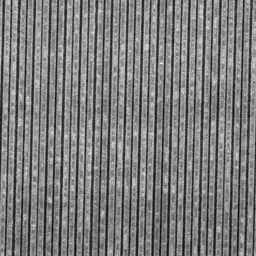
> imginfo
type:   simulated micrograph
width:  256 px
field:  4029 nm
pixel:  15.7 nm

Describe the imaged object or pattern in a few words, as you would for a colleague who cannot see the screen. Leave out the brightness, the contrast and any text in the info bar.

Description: parallel lines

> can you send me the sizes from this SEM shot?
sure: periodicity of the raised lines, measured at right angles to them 122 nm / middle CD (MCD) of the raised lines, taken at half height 82.6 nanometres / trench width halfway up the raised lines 41.3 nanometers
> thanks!